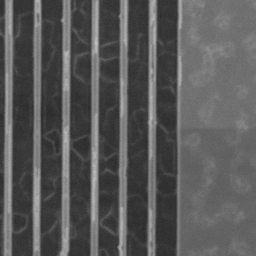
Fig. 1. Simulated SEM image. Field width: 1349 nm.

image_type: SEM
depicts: parallel lines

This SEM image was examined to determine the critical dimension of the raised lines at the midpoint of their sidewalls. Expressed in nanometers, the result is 33.6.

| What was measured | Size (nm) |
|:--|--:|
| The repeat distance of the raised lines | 152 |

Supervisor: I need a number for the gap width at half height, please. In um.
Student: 0.119